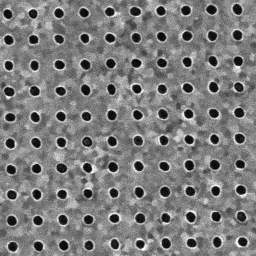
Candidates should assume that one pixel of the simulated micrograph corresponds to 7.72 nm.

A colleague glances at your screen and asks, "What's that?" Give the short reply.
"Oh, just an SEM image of a regular array of holes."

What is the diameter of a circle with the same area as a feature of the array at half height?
76.4 nanometers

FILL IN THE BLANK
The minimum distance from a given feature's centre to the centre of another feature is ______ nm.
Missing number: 195